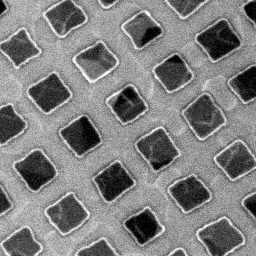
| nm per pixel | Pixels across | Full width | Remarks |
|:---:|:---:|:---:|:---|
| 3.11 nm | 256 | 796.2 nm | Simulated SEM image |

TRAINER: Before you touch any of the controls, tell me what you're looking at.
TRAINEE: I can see a regular array of raised bodies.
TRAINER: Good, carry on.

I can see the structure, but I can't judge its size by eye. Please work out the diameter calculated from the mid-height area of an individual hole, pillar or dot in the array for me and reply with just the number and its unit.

117 nanometers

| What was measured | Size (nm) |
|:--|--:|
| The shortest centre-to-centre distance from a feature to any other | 167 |